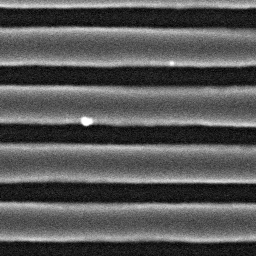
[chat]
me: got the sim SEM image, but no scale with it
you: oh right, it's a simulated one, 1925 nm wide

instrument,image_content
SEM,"lines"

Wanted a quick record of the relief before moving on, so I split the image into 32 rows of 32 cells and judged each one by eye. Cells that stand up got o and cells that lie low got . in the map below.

oooooooooooooooooooooooooooooooo
................................
................................
................................
oooooooooooooooooooooooooooooooo
oooooooooooooooooooooooooooooooo
oooooooooooooooooooooooooooooooo
oooooooooooooooooooooooooooooooo
................................
................................
................................
oooooooooooooooooooooooooooooooo
oooooooooooooooooooooooooooooooo
oooooooooooooooooooooooooooooooo
oooooooooooooooooooooooooooooooo
..........o.......o......ooooooo
................................
................................
oooooooooooooooooooooooooooooo..
oooooooooooooooooooooooooooooooo
oooooooooooooooooooooooooooooooo
oooooooooooooooooooooooooooooooo
oooooo....oooooooooooooooooooooo
................................
................................
oo..............................
oooooooooooooooooooooooooooooooo
oooooooooooooooooooooooooooooooo
oooooooooooooooooooooooooooooooo
oooooooooooooooooooooooooooooooo
................................
................................